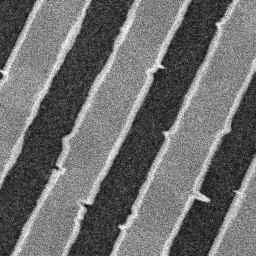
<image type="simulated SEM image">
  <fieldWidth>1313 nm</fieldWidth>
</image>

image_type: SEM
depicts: one or a few lines or trenches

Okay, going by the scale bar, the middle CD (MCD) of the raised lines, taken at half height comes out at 0.239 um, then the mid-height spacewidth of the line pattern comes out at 212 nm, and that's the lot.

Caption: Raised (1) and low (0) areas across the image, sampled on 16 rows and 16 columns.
0011100011110011
0011100011100011
0111000111100111
0111000111000111
1110001111000111
1110001110001110
1100011110001110
1100011100011100
1000111100011100
1000111000111000
1000111000111000
0001110001110001
0001110001110001
0011100011100011
0011100011100011
0111000111100111